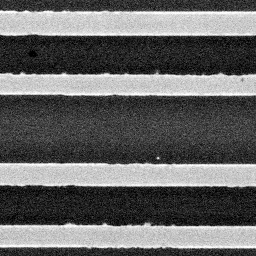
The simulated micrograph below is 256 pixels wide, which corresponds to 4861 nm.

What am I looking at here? lines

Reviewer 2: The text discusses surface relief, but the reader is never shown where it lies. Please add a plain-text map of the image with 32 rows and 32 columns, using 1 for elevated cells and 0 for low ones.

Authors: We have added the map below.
00000000000000000000000000000000
01000000000000000000000000000000
11111111111111111111111111111111
11111111111111111111111111111111
00000000000000000000000000000000
00000000000000000000000000000000
00000000000000000000000000000000
00000000000000000000000000000000
00000000000000000000000000000000
11111111111111111111110000100000
11111111111111111111111111111111
11111111111111111111111111111111
00000000000000000000000000000000
00000000000000000000000000000000
00000000000000000000000000000000
00000000000000000000000000000000
00000000000000000000000000000000
00000000000000000000000000000000
00000000000000000000000000000000
00000000000000000000000000000000
00000000000000000000000000000000
11111111111111111111111111111111
11111111111111111111111111111111
00000000000000000000000000000000
00000000000000000000000000000000
00000000000000000000000000000000
00000000000000000000000000000000
00000000000000000000000000000000
11111111111111111111111111111111
11111111111111111111111111111111
11111111111111111111111111111111
00000000000000000000000000000000